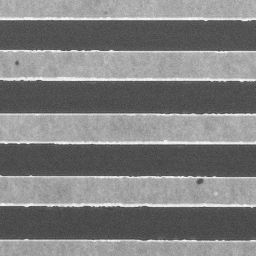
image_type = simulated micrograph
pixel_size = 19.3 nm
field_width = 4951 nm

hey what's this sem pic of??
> lines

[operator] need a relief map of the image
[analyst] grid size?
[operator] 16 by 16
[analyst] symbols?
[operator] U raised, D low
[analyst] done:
UUUUUUUUUUUUUUUU
DDDDDDDDDDDDDDDD
DDDDDDDDDDDDDDDD
UUUUUUUUUUUUUUUU
UUUUUUUUUUUUUUUU
DDDDDDDDDDDDDDDD
DDDDDDDDDDDDDDDD
UUUUUUUUUUUUUUUU
UUUUUUUUUUUUUUUU
DDDDDDDDDDDDDDDD
DDDDDDDDDDDDDDDD
UUUUUUUUUUUUUUUU
UUUUUUUUUUUUUUUU
DDDDDDDDDDDDDDDD
DDDDDDDDDDDDDDDD
UUUUUUUUUUUUUUUU